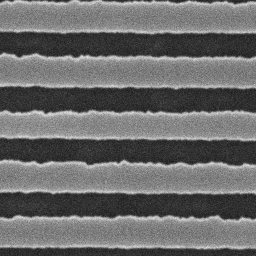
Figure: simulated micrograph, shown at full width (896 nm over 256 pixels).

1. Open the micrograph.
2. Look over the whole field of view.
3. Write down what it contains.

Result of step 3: lines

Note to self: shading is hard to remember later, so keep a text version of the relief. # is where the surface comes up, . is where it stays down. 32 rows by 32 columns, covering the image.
#############################.##
################################
################################
################################
................................
................................
................................
################################
################################
################################
################################
................................
................................
................................
################################
################################
################################
..............................##
................................
................................
###########.########..#..###....
################################
################################
################################
................................
................................
................................
#############################.##
################################
################################
################################
................................